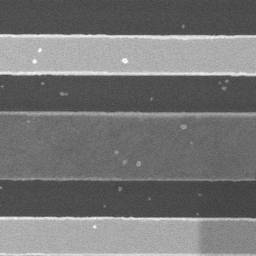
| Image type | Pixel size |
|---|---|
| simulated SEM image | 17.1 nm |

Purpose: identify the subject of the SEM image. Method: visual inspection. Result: lines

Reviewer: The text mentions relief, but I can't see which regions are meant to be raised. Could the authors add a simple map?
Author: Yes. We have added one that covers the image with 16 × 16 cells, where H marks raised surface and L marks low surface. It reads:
LLLLLLLLLLLLLLLL
LLLLLLLLLLLLLLLL
HHHHHHHHHHHHHHHH
HHHHHHHHHHHHHHHH
HHHHHHHHHHHHHHHH
LLLLLLLLLLLLLLLL
LLLLLLLLLLLLLLLL
HHHHHHHHHHHHHHHH
HHHHHHHHHHHHHHHH
HHHHHHHHHHHHHHHH
HHHHHHHHHHHHHHHH
LLLLLLLLLLLLLLLL
LLLLLLLLLLLLLLLL
LLLLLLLLLLLLLLLL
HHHHHHHHHHHHHHHH
HHHHHHHHHHHHHHHH